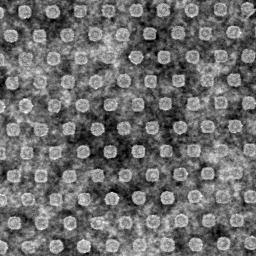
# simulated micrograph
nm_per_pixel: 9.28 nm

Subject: a regular array of raised bodies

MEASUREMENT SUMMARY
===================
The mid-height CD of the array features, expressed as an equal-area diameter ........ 120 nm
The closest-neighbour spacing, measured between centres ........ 0.248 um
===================